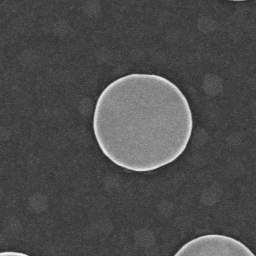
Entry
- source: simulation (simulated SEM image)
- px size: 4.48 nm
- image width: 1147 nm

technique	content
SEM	raised bodies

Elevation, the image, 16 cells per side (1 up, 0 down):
0000000000000000
0000000000000000
0000000000000000
0000000000000000
0000000000000000
0000000111100000
0000001111110000
0000001111110000
0000001111110000
0000000111100000
0000000011000000
0000000000000000
0000000000000000
0000000000000000
0000000000000000
0000000000011110